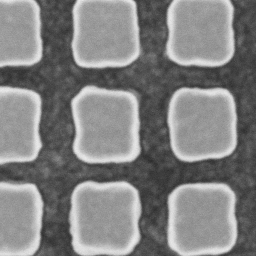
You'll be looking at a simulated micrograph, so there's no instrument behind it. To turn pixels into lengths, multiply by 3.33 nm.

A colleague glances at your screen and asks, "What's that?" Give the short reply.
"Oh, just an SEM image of raised bodies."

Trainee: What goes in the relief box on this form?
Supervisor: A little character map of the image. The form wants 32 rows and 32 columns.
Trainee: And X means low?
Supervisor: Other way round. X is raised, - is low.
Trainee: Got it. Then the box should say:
XXXXX----XXXXXXXX----XXXXXXXX---
XXXXX----XXXXXXXX----XXXXXXXX---
XXXXX----XXXXXXXX----XXXXXXXX---
XXXXX----XXXXXXXX----XXXXXXXX---
XXXXX----XXXXXXXX----XXXXXXXX---
XXXXX----XXXXXXXX----XXXXXXXX---
XXXXX----XXXXXXXX----XXXXXXXX---
XXXXX----XXXXXXXX-----XXXXXXX---
--------------------------------
--------------------------------
--------------------------------
XXXX------XXXXXX------XXXXXX----
XXXXX----XXXXXXXX----XXXXXXXX---
XXXXX----XXXXXXXX----XXXXXXXX---
XXXXX----XXXXXXXX----XXXXXXXXX--
XXXXX----XXXXXXXX----XXXXXXXXX--
XXXXX----XXXXXXXX----XXXXXXXX---
XXXXX----XXXXXXXX----XXXXXXXX---
XXXXX----XXXXXXXX-----XXXXXXX---
XXXXX-----XXXXXXX-----XXXXXX----
--------------------------------
--------------------------------
--------------------------------
XXXX------XXXXXXX-----XXXXXX----
XXXXX----XXXXXXXX-----XXXXXXX---
XXXXX----XXXXXXXX----XXXXXXXX---
XXXXX----XXXXXXXX----XXXXXXXX---
XXXXX----XXXXXXXX----XXXXXXXX---
XXXXX----XXXXXXXX----XXXXXXXXX--
XXXXX----XXXXXXXX----XXXXXXXX---
XXXXX----XXXXXXXX----XXXXXXXX---
XXXX------XXXXXX------XXXXXX----